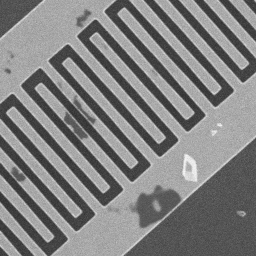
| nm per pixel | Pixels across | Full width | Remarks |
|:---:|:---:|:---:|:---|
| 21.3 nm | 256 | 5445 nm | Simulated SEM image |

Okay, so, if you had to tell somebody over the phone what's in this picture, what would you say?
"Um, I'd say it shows groups of lines, slits or small figures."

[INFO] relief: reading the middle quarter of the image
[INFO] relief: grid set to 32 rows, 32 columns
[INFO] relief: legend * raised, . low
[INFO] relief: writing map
***...***...****...***...***...*
.***...***...****...***...***...
..***...***...***....***...***..
...***...***...***...****...***.
*..****...***...***...****..****
**..****...***...***...****..***
**...****...***...***...***...**
***...***....***...***...***...*
.***...***...****...***...***...
..***...***...***...****...***..
...***...***...****..****..****.
*...***...***...***...****..****
**..****...***...***...****..***
**...****...***...***...***...*.
***...***...****...***...***....
.***...***...****...***...***...
..***...***...****..****...***..
...***...***...***...****...****
*...***...***...***...***...****
*...****...***...***...*....****
***..****...***...***......*****
***...****..****...***....******
.***...***...****...***..*******
..***...***...****..************
...***...***...***...***********
*...***...***...*.....**********
**..****...***.......***********
**...****...***.....************
***...****...***..**************
.***...***...*******************
..***...***...******************
...***...**....*****************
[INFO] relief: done